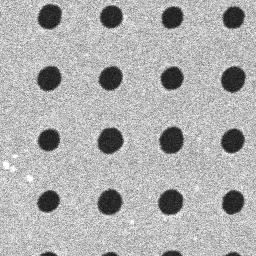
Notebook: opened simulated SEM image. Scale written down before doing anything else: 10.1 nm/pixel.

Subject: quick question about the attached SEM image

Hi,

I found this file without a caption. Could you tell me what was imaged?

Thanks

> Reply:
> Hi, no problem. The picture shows a regular array of holes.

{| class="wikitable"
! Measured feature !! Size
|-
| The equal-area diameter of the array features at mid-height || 248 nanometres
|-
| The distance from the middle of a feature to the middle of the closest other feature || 617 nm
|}